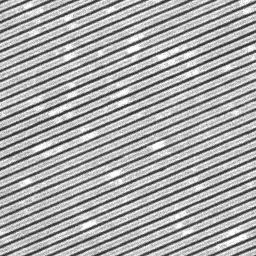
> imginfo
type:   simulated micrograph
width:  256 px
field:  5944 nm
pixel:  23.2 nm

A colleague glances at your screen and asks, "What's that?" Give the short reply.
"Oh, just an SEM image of parallel lines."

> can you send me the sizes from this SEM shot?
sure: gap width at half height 82.8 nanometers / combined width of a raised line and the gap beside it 209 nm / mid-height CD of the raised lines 0.126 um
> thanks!